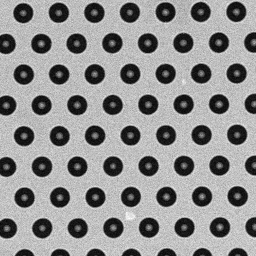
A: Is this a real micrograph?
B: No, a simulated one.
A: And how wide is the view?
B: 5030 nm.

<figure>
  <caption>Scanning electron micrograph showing an array of small figures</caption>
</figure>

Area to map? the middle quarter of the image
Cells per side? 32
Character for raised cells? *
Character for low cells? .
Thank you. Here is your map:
******...******...******...*****
.****.....****.....****.....****
.****..*..****..*..****..*..****
.****.....****.....****.....****
.*****...******...******...*****
********************************
********************************
********************************
*....*****....*****....*****....
*.....****.....****....****.....
*..*..****.....****.....***.....
*.....****.....****....*****....
**...******...******..*******..*
********************************
********************************
******...*******.********..*****
.****.....*****....****.....****
.****.....****..*..****..*..****
..***.....****.....****.....****
.*****....*****....****....*****
*******.********.***************
********************************
********************************
**...******...******...*****....
*.....****.....****.....***.....
*..*..****..*..***......***.....
*.....****.....****.....****....
**...*****....******...*****...*
********************************
********************************
********************************
.*****....*****....*****....****